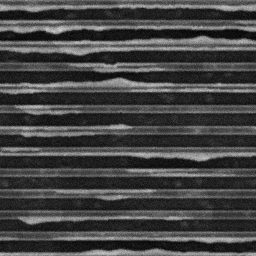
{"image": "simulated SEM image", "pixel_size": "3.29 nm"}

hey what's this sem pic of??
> parallel lines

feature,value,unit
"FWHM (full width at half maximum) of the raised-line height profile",0.028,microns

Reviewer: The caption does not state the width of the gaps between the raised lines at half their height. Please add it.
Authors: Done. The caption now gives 42.4 nanometres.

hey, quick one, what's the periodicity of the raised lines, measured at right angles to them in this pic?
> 69.5 nanometers